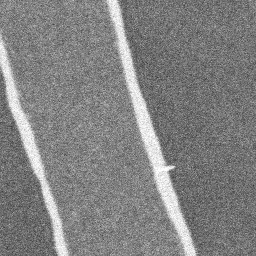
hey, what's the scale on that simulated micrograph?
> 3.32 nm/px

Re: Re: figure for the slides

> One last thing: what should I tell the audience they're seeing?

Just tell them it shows one or a few lines or trenches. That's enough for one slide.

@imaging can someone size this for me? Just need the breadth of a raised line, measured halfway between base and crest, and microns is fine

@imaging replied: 0.391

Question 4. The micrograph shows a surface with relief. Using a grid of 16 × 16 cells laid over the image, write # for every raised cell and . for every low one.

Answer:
#######.........
#######.........
########........
########........
########........
.#######........
.########.......
.########.......
..#######.......
..########......
..########......
...#######......
...########.....
...########.....
....########....
....########....